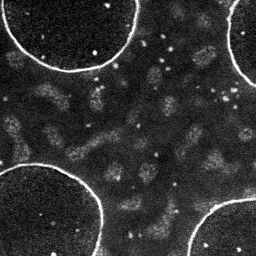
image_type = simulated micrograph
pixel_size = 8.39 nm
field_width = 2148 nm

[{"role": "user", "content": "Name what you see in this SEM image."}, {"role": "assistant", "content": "raised bodies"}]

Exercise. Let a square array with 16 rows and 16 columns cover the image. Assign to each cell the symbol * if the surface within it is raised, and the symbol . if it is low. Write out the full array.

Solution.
*********.....**
********......**
.*******......**
..*****........*
...............*
................
................
................
................
................
.**.............
*****...........
******.........*
******.......***
******......****
******......****